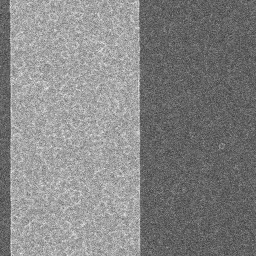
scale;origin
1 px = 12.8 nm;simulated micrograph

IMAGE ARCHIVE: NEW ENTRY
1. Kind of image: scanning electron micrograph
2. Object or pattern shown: one or a few lines or trenches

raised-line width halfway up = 128 px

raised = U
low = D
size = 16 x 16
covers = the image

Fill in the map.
DUUUUUUUUDDDDDDD
DUUUUUUUUDDDDDDD
DUUUUUUUUDDDDDDD
DUUUUUUUUDDDDDDD
DUUUUUUUUDDDDDDD
DUUUUUUUUDDDDDDD
DUUUUUUUUDDDDDDD
DUUUUUUUUDDDDDDD
DUUUUUUUUDDDDDDD
DUUUUUUUUDDDDDDD
DUUUUUUUUDDDDDDD
DUUUUUUUUDDDDDDD
DUUUUUUUUDDDDDDD
DUUUUUUUUDDDDDDD
DUUUUUUUUDDDDDDD
DUUUUUUUUDDDDDDD